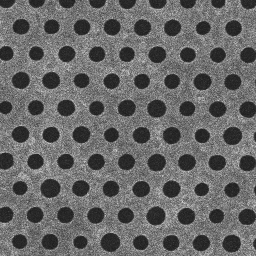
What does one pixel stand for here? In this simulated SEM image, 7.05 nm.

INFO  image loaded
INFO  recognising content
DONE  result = a regular array of holes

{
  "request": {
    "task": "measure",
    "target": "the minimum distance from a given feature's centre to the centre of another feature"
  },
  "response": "212 nanometres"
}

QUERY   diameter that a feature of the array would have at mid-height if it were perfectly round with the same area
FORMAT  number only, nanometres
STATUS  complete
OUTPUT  117